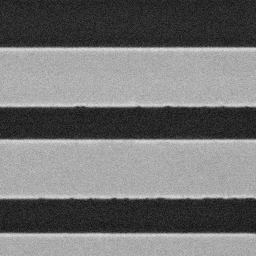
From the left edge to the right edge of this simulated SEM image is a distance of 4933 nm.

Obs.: lines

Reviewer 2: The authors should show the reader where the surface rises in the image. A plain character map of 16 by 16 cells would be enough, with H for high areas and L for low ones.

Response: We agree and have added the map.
LLLLLLLLLLLLLLLL
LLLLLLLLLLLLLLLL
LLLLLLLLLLLLLLLL
HHHHHHHHHHHHHHHH
HHHHHHHHHHHHHHHH
HHHHHHHHHHHHHHHH
HHHHHHHHHHHHHHHH
LLLLLLLLLLLLLLLL
LLLLLLLLLLLLLLLL
HHHHHHHHHHHHHHHH
HHHHHHHHHHHHHHHH
HHHHHHHHHHHHHHHH
LLLLLLLLLLLLLLLL
LLLLLLLLLLLLLLLL
LLLLLLLLLLLLLLLL
HHHHHHHHHHHHHHHH